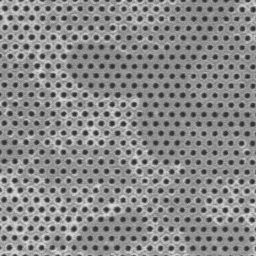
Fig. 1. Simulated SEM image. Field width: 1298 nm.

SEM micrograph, a regular array of holes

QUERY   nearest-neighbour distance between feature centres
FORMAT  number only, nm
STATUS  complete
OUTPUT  53.7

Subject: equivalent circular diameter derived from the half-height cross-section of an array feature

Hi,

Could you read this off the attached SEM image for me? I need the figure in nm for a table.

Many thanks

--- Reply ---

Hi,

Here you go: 27.4